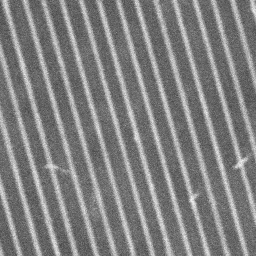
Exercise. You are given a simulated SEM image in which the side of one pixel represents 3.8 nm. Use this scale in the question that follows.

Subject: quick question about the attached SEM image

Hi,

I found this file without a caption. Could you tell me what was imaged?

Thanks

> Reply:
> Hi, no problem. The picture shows parallel lines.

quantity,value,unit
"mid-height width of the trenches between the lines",56.6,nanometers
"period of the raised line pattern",0.0692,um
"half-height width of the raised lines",0.0151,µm